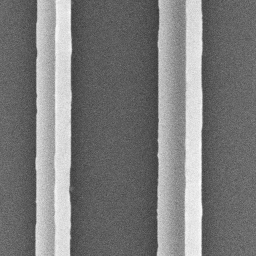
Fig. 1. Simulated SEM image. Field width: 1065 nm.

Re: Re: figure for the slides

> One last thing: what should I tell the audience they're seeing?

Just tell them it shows lines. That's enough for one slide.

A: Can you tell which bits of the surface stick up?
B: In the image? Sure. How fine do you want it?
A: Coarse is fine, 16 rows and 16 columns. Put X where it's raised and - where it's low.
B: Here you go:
--XX------XXX---
--XX------XXX---
--XX------XXX---
--XX------XXX---
--XX------XXX---
--XX------XXX---
--XX------XXX---
--XX------XXX---
--XX------XXX---
--XX------XXX---
--XX------XXX---
--XX------XXX---
--XX------XXX---
--XX------XXX---
--XX------XXX---
--XX------XXX---